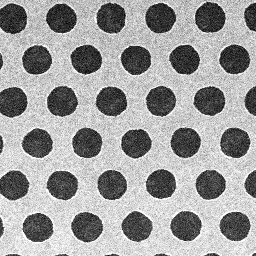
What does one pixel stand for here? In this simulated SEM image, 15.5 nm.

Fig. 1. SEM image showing a regular array of holes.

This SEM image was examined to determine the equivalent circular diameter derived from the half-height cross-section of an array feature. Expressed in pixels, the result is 31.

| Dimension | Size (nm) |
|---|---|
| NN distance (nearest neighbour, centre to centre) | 744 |